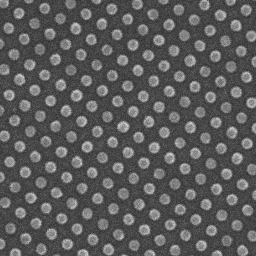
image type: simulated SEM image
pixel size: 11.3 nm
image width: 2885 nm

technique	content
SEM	a regular array of raised bodies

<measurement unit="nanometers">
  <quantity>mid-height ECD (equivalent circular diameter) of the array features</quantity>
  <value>112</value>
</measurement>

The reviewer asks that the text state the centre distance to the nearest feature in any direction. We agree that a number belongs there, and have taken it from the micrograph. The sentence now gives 206 nm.